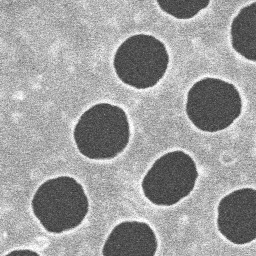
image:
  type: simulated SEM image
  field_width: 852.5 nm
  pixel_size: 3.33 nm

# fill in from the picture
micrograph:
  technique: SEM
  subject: holes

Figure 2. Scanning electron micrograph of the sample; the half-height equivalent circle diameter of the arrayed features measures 184 nm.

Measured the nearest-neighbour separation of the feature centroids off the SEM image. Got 275 nm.